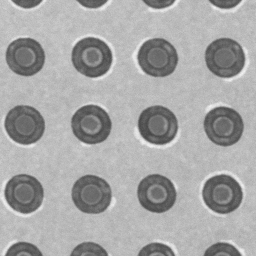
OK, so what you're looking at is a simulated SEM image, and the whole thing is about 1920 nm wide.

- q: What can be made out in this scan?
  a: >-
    a regular array of ring-shaped grooves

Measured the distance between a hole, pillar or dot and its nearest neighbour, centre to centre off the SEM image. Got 66.3 pixels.